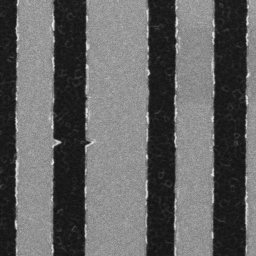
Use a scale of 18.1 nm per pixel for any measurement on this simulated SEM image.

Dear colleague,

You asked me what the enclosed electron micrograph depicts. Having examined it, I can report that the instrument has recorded one or a few lines or trenches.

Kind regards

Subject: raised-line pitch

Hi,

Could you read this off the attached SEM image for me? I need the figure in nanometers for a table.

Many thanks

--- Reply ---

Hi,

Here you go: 1450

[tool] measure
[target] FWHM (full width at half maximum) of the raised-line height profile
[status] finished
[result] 602 nm